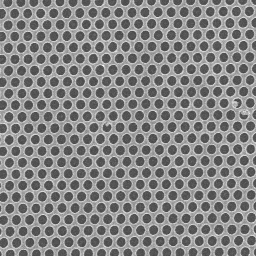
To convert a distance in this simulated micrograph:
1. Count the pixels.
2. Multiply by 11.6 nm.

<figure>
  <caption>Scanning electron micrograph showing a regular array of holes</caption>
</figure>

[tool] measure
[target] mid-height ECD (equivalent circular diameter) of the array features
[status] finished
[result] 112 nm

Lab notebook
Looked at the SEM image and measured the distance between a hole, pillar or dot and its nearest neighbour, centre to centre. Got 149 nm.